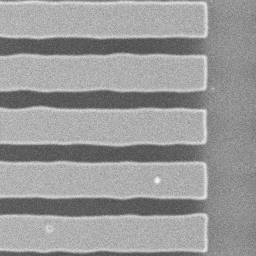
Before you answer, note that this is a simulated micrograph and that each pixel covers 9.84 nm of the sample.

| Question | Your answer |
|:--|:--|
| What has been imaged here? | groups of lines, slits or small figures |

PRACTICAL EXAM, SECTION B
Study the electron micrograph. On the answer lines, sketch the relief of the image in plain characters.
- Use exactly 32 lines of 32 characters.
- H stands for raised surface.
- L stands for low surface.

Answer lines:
HHHHHHHHHHHHHHHHHHHHHHHHHLLLLLLL
HHHHHHHHHHHHHHHHHHHHHHHHHHLLLLLL
HHHHHHHHHHHHHHHHHHHHHHHHHHLLLLLL
HHHHHHHHHHHHHHHHHHHHHHHHHHLLLLLL
HHHHHHHHHHHHHHHHHHHHHHHHHLLLLLLL
LLLLLLLLLLLLLLLLLLLLLLLLLLLLLLLL
LLLLLLLLLLLLLLLLLLLLLLLLLLLLLLLL
HHHHHHHHHHHHHHHHHHHHHHHHHHLLLLLL
HHHHHHHHHHHHHHHHHHHHHHHHHHLLLLLL
HHHHHHHHHHHHHHHHHHHHHHHHHHLLLLLL
HHHHHHHHHHHHHHHHHHHHHHHHHHLLLLLL
LLLLLLLLLLLLLLLLLLLLLLLLLLLLLLLL
LLLLLLLLLLLLLLLLLLLLLLLLLLLLLLLL
LLLLHHLLLLLLLLLLLLLLLLLLLLLLLLLL
HHHHHHHHHHHHHHHHHHHHHHHHHHLLLLLL
HHHHHHHHHHHHHHHHHHHHHHHHHHLLLLLL
HHHHHHHHHHHHHHHHHHHHHHHHHHLLLLLL
HHHHHHHHHHHHHHHHHHHHHHHHHHLLLLLL
LLLLLLLLLLLLLLLLLLLLLLLLLLLLLLLL
LLLLLLLLLLLLLLLLLLLLLLLLLLLLLLLL
HHHHHHHHHHHHHHHHHHHHHHHHHLLLLLLL
HHHHHHHHHHHHHHHHHHHHHHHHHHLLLLLL
HHHHHHHHHHHHHHHHHHHHHHHHHHLLLLLL
HHHHHHHHHHHHHHHHHHHHHHHHHHLLLLLL
HHHHHHHHHHHHHHHHHHHHHHHHHHLLLLLL
LLLLLLLLLLLLLLLLLLLLLLLLLLLLLLLL
LLLLLLLLLLLLLLLLLLLLLLLLLLLLLLLL
HHHHHHHHHHHHHHHHHHHHHHHHHHLLLLLL
HHHHHHHHHHHHHHHHHHHHHHHHHHLLLLLL
HHHHHHHHHHHHHHHHHHHHHHHHHHLLLLLL
HHHHHHHHHHHHHHHHHHHHHHHHHHLLLLLL
LLLLLLLLLLLLLLLLLLLLLLLLLLLLLLLL